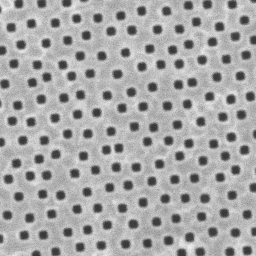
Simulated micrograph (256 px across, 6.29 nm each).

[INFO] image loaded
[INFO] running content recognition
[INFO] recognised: a regular array of holes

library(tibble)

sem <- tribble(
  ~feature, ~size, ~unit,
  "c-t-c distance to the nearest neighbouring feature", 118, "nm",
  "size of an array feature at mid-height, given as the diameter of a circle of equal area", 10.3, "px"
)